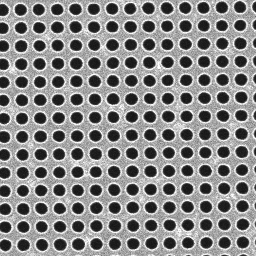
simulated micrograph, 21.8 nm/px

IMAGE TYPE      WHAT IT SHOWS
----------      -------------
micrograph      a regular array of holes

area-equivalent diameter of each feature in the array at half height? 250 nm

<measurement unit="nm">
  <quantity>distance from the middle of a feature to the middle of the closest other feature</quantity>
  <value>391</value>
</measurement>